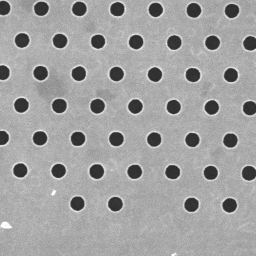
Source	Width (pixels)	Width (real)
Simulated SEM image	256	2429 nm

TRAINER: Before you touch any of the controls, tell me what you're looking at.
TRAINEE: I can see a regular array of holes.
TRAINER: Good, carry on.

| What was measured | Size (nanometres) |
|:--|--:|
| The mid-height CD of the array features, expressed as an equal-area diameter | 139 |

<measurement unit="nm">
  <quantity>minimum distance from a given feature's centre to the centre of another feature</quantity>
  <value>355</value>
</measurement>